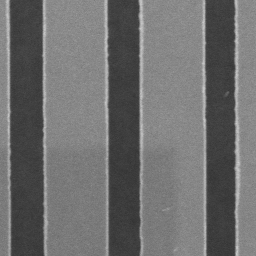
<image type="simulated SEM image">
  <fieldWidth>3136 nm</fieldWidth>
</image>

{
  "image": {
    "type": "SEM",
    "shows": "lines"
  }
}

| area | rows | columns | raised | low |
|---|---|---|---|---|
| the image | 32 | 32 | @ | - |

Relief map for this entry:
@----@@@@@@@@----@@@@@@@@@---@@@
@----@@@@@@@@----@@@@@@@@@---@@@
@----@@@@@@@@----@@@@@@@@@---@@@
@----@@@@@@@@----@@@@@@@@@---@@@
@----@@@@@@@@-----@@@@@@@@---@@@
@----@@@@@@@@-----@@@@@@@@---@@@
@----@@@@@@@@-----@@@@@@@@---@@@
@----@@@@@@@@-----@@@@@@@@---@@@
@----@@@@@@@@-----@@@@@@@@---@@@
@----@@@@@@@@-----@@@@@@@@---@@@
@----@@@@@@@@-----@@@@@@@@---@@@
@----@@@@@@@@-----@@@@@@@@---@@@
@----@@@@@@@@-----@@@@@@@@---@@@
@----@@@@@@@@-----@@@@@@@@---@@@
@----@@@@@@@@-----@@@@@@@@---@@@
@-----@@@@@@@-----@@@@@@@@---@@@
@----@@@@@@@@-----@@@@@@@@---@@@
@----@@@@@@@@-----@@@@@@@@---@@@
@----@@@@@@@@-----@@@@@@@@---@@@
@----@@@@@@@@-----@@@@@@@@---@@@
@----@@@@@@@@-----@@@@@@@@---@@@
@----@@@@@@@@-----@@@@@@@@---@@@
@-----@@@@@@@-----@@@@@@@@---@@@
@-----@@@@@@@-----@@@@@@@@---@@@
@-----@@@@@@@-----@@@@@@@@---@@@
@-----@@@@@@@-----@@@@@@@@---@@@
@-----@@@@@@@-----@@@@@@@@---@@@
@-----@@@@@@@-----@@@@@@@@---@@@
@-----@@@@@@@-----@@@@@@@@---@@@
@-----@@@@@@@-----@@@@@@@@---@@@
@-----@@@@@@@-----@@@@@@@@---@@@
@-----@@@@@@@-----@@@@@@@@---@@@